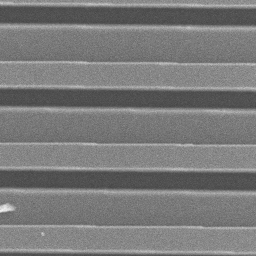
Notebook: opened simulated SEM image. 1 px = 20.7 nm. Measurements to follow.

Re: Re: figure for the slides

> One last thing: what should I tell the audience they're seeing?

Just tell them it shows lines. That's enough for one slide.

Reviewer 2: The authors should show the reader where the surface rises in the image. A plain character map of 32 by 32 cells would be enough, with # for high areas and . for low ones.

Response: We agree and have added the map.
..........######################
................................
................................
#########################.......
################################
################################
################################
################################
################################
################################
################################
................................
................................
................................
################################
################################
################################
################################
################################
################################
################################
................................
................................
................................
################################
################################
################################
################################
################################
################################
################################
.................###############